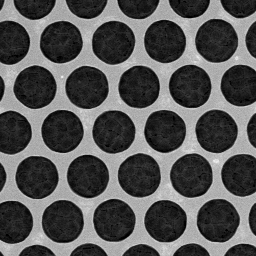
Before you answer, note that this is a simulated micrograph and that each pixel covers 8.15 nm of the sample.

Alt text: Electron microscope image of a regular array of holes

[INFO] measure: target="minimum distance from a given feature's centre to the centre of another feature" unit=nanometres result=416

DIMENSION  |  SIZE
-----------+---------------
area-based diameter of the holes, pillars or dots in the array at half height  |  0.349 micrometres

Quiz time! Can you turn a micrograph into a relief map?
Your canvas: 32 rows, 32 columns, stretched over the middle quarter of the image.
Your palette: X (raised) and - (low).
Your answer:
XXXXX-XXXXXXXXXXX---XXXXXXXXXX--
XXX------XXXXXXX------XXXXXX----
XX--------XXXXX--------XXXX-----
X----------XXX----------XX------
-----------XXX----------XX------
-----------XXX----------XX------
-----------XXX----------XX------
X----------XXX----------XXX-----
X----------XXX---------XXXX-----
XX--------XXXXX--------XXXXX----
XXX------XXXXXXX-----XXXXXXXX---
-XXXXXXXXXXXXXXXXXXXXXXX--XXXXXX
---XXXXXX-------XXXXXX------XXXX
----XXXX---------XXXX--------XXX
----XXXX---------XXXX---------XX
-----XX-----------XX----------XX
-----XX-----------XX-----------X
-----XX-----------XX-----------X
-----XX-----------XX----------XX
----XXXX---------XXXX---------XX
---XXXXXX--------XXXXX-------XXX
--XXXXXXX------XXXXXXXX-----XXXX
XXXXXXXXXXXX-XXXXX--XXXXXXXXXXX-
XXX------XXXXXXX------XXXXXXX---
XX--------XXXXX--------XXXXX----
X----------XXX----------XXX-----
X----------XXX----------XXX-----
X----------XX-----------XX------
X----------XX-----------XX------
X----------XXX----------XXX-----
X----------XXX----------XXX-----
XX--------XXXXX--------XXXXX----